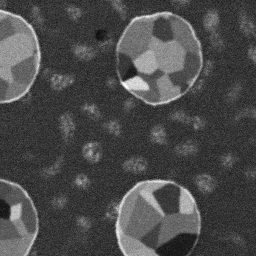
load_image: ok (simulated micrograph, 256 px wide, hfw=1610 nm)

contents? raised bodies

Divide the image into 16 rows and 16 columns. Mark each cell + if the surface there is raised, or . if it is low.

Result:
................
++......++++....
++......++++....
++.....++++++...
++.....+++++....
++......++++....
................
................
................
................
................
+........++.....
++......++++....
++.....+++++....
++.....+++++....
++......++++....